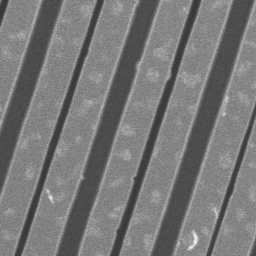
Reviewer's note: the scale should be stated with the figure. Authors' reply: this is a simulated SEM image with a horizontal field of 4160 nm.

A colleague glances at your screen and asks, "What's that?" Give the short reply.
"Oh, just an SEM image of parallel lines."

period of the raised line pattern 735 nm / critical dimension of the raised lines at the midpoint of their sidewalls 0.539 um